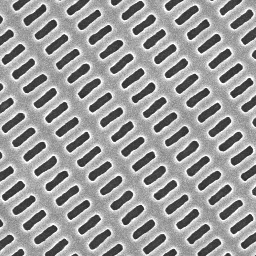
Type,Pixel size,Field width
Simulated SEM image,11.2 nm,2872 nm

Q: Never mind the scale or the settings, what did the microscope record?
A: a regular array of holes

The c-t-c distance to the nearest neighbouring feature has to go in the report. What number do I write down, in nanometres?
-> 203